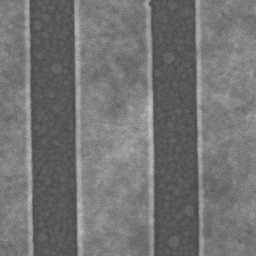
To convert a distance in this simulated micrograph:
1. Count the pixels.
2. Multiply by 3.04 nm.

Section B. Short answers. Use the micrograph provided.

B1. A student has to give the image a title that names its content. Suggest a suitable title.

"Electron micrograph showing one or a few lines or trenches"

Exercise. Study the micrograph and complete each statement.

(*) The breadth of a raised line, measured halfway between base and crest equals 0.223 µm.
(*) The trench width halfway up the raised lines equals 147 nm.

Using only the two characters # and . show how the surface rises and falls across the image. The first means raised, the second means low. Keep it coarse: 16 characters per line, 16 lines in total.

##...####...####
##...####...####
##...####...####
##...####...####
##...####...####
##...####...####
##...####...####
##...####...####
##...####...####
##...####...####
##...####....###
##...####....###
##...####....###
##...####....###
##...####....###
##...#####...###